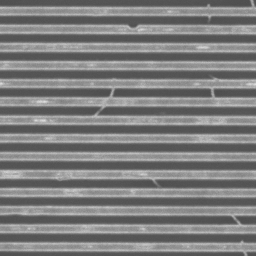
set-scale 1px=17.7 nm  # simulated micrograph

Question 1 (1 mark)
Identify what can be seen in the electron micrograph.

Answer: parallel lines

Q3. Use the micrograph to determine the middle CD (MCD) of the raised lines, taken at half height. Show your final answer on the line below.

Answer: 0.159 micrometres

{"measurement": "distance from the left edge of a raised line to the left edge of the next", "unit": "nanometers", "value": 321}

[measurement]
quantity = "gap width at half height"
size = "8.87 pixels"